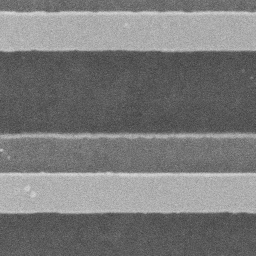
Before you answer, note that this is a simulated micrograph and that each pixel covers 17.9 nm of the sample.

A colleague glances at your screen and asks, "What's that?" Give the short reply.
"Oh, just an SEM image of lines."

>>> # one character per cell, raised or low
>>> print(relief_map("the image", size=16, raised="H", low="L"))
HHHHHHHHHHHHHHHH
HHHHHHHHHHHHHHHH
HHHHHHHHHHHHHHHH
LLLLLLLLLLLLLLLL
LLLLLLLLLLLLLLLL
LLLLLLLLLLLLLLLL
LLLLLLLLLLLLLLLL
LLLLLLLLLLLLLLLL
LLLLLLLLLLLLLLLL
HHHHHHHHHHHHHHHH
HHHHHHHHHHHHHHHH
HHHHHHHHHHHHHHHH
HHHHHHHHHHHHHHHH
LLLLLLLLLLLLLLLL
LLLLLLLLLLLLLLLL
LLLLLLLLLLLLLLLL